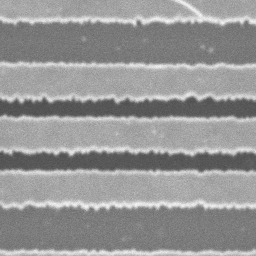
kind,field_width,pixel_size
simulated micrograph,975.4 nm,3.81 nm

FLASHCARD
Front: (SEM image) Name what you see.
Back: lines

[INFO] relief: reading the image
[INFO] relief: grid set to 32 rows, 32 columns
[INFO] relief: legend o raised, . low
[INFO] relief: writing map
oooooooooooooooooooooooooooooooo
oooooooooooooooooooooooooooooooo
oooooooooooooooooooooooooooooooo
................................
................................
................................
................................
................................
oooooooooooooooooooooooooooooooo
oooooooooooooooooooooooooooooooo
oooooooooooooooooooooooooooooooo
oooooooooooooooooooooooooooooooo
.oo.o.oo..o...o.oo..o.o....o....
................................
................................
oooooooooooooooooooooooooooooooo
oooooooooooooooooooooooooooooooo
oooooooooooooooooooooooooooooooo
oooooooooooooooooooooooooooooooo
................................
................................
oooooooooooooooooooooooooooooooo
oooooooooooooooooooooooooooooooo
oooooooooooooooooooooooooooooooo
oooooooooooooooooooooooooooooooo
oooooooooooooooooooooooooooooooo
................................
................................
................................
................................
................................
ooooooooooooo.oooo.oooo..oo.oo.o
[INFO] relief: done